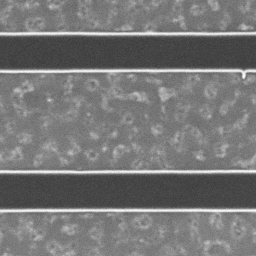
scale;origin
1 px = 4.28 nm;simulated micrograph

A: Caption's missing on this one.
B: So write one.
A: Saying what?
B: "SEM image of one or a few lines or trenches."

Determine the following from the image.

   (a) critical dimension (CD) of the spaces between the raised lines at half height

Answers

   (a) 429 nanometres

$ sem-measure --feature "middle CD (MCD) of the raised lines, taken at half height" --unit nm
169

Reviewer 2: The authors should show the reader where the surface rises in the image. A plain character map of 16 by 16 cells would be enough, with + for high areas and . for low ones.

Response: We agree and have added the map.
................
................
++++++++++++++++
++++++++++++++++
................
................
................
................
................
................
................
++++++++++++++++
++++++++++++++++
................
................
................